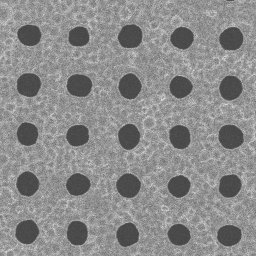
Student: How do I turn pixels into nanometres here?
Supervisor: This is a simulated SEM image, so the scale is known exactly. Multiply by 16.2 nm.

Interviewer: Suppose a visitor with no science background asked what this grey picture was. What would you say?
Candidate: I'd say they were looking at a regular array of holes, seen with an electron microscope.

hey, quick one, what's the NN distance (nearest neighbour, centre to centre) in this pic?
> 0.793 micrometres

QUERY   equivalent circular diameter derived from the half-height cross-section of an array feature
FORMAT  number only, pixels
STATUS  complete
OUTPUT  23.2